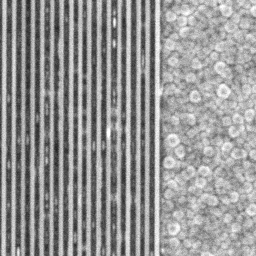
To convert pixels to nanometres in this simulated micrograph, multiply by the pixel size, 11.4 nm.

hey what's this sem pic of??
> parallel lines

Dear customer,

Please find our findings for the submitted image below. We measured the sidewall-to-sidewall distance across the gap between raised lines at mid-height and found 68.3 nanometers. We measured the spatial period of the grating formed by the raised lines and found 0.109 micrometres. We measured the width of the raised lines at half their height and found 34.1 nanometres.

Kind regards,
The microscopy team